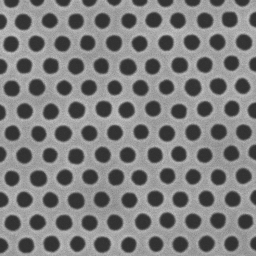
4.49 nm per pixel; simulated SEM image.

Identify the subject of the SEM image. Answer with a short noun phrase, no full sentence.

a regular array of holes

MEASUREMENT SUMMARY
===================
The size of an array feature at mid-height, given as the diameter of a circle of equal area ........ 71.1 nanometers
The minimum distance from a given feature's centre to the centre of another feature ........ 0.111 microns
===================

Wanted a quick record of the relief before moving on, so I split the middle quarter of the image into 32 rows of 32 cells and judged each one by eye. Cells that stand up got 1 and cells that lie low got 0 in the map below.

10000110000111000011000011100001
10000111000111000011000011100001
11001111101111100111110111111111
11111111111111111111111111111111
01111000111100111100111100011110
00110000111000111000011100011100
00110000111000011000011100011100
01111001111100111100011110111110
11111111111111111111111111111111
11001111100111111111100111111111
10000111000011000111000011100011
10000111000010000011000011100001
10000111000011000111100011100001
11001111111111101111111111110011
11111111111111111111111111111111
11111001111100111100111110011110
00110000111000011000011100001100
00110000111000011100011100001100
00111000111000111100111100011110
11111111111111111111111111111111
11111111111111111111111111111111
11001111000111000111100011100011
10000111000011000011100001100001
10000111000011000011100001100001
10000111100111100111110011110111
11111111111111111111111111111111
01111101111100111111111110011110
00111000111000011000011100001110
00111000011000011000011100001100
00111000111000011000111110011110
11111111111111111111111111111111
11111111111111111111111111111111